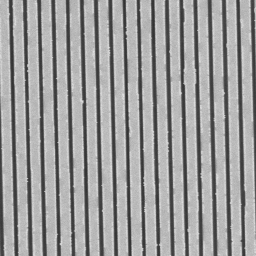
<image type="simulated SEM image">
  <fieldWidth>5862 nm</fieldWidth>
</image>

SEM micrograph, parallel lines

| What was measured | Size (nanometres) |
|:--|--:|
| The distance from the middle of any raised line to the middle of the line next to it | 326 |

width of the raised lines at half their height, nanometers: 240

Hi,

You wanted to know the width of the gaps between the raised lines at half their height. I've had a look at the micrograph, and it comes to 85.8 nanometres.